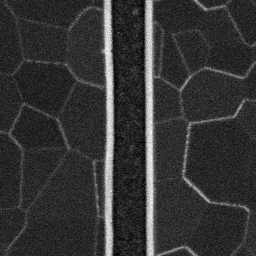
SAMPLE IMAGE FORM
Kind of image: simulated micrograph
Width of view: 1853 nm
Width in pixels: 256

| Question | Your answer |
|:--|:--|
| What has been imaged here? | one or a few lines or trenches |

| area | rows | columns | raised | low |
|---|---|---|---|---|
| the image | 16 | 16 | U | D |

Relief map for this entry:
UUUUUUUDDUUUUUUU
UUUUUUUDDUUUUUUU
UUUUUUUDDUUUUUUU
UUUUUUUDDUUUUUUU
UUUUUUUDDUUUUUUU
UUUUUUUDDUUUUUUU
UUUUUUUDDUUUUUUU
UUUUUUUDDUUUUUUU
UUUUUUUDDUUUUUUU
UUUUUUUDDUUUUUUU
UUUUUUUDDUUUUUUU
UUUUUUUDDUUUUUUU
UUUUUUUDDUUUUUUU
UUUUUUUDDUUUUUUU
UUUUUUUDDUUUUUUU
UUUUUUUDDUUUUUUU